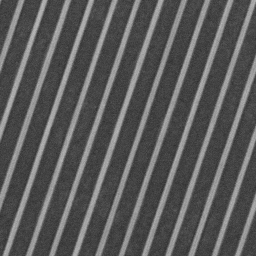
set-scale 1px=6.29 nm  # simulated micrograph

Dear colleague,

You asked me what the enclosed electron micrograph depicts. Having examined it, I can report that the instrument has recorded parallel lines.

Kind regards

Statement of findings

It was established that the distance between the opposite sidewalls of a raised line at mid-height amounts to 26.1 nm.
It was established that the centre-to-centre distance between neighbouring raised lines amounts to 138 nm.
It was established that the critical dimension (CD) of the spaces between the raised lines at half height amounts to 17.8 pixels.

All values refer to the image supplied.